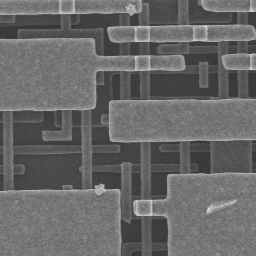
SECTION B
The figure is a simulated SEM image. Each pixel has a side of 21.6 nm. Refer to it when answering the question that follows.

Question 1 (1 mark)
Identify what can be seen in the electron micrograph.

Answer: wiring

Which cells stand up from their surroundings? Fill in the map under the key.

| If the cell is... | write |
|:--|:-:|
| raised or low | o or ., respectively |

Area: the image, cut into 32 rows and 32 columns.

oooooooooooooooooo.......ooooooo
ooooooooooooooooo...............
................................
..............oooooooooooooooooo
..............oooooooooooooooooo
oooooooooooo....................
oooooooooooo....................
ooooooooooooooooooooooo.....oooo
ooooooooooooooooooooooo.....oooo
oooooooooooo....................
oooooooooooo....................
oooooooooooo....................
oooooooooooo.........oooo..ooooo
oooooooooooo..oooooooooooooooooo
..............oooooooooooooooooo
..............oooooooooooooooooo
..............oooooooooooooooooo
..............ooooooooooooooo...
................................
................................
................................
................................
.....................ooooooooooo
............o........ooooooooooo
ooooooooooooooo......ooooooooooo
ooooooooooooooo..ooooooooooooooo
ooooooooooooooo..ooooooooooooooo
ooooooooooooooo......ooooooooooo
ooooooooooooooo......ooooooooooo
ooooooooooooooo......ooooooooooo
ooooooooooooooo......ooooooooooo
ooooooooooooooo......ooooooooooo